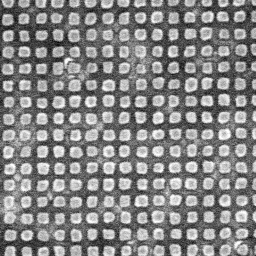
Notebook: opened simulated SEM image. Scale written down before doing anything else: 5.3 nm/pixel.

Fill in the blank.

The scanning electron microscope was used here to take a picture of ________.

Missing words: a regular array of raised bodies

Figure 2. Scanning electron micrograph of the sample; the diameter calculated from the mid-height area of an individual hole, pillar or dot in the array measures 56.5 nm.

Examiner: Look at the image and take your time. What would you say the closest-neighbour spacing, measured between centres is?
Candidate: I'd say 0.0848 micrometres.